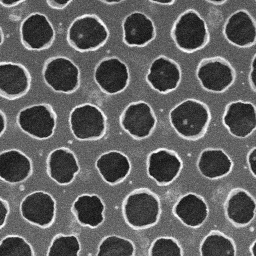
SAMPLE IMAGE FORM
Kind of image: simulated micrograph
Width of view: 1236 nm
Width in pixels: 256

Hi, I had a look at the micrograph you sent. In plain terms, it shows a regular array of holes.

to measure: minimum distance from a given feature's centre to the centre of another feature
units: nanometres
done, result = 241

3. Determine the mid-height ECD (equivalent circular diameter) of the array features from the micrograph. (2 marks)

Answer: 158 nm